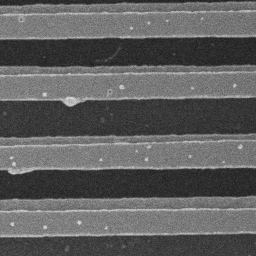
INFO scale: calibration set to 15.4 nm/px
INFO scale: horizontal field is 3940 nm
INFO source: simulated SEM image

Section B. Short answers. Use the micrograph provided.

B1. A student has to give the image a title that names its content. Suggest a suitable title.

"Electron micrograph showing lines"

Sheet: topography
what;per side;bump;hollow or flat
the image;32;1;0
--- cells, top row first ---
00000000000000010000000111111111
11111111111111111111111111111111
11111111111111111111111111111111
11111111111111111111111111111111
11111111111111111111111111111111
00000000000000000000000000000000
00000000000000000000000000000000
00000000000000000000000000000000
11111000111011111111111111111111
11111111111111111111111111111111
11111111111111111111111111111111
11111111111111111111111111111111
00000001111000000000000000000000
00000000000000000000000000000000
00000000000000000000000000000000
00000000000000000000000000000000
00000000000000000000000000000000
11111111111111111111111111111111
11111111111111111111111111111111
11111111111111111111111111111111
11111111111111111111111111111111
01100000000000000000000000000000
00000000000000000000000000000000
00000000000000000000000000000000
00000000000000000000000000000000
11111111111111111111111111111111
11111111111111111111111111111111
11111111111111111111111111111111
11111111111111111111111111111111
11111100000000000000000000000000
00000000000000000000000000000000
00000000000000000000000000000000